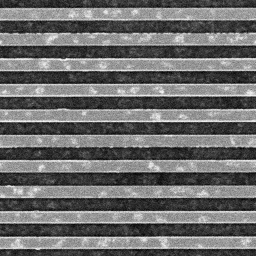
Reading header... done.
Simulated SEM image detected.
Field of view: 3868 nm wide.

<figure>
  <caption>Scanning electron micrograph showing parallel lines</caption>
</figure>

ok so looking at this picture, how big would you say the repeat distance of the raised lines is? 384 nanometers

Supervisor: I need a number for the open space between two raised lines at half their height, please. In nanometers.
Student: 208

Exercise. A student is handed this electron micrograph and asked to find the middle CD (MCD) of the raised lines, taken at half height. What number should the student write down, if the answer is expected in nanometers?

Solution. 178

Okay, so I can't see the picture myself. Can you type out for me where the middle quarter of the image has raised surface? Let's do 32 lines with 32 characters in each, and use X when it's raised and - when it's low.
XXXXXXXXXXXXXXXXXXXXXXXXXXXXXXXX
-----------------------------XXX
--------------------------------
--------------------------------
--------------------------------
XXXXXXXXXXXXXXXXXXXXXXXXXXXXXXXX
XXXXXXXXXXXXXXXXXXXXXXXXXXXXXXXX
XXXXXXXXXXXXXXXXXXXXXXXXXXXXXXXX
--------------------------------
--------------------------------
--------------------------------
XXXXXXX-------------------------
XXXXXXXXXXXXXXXXXXXXXXXXXXXXXXXX
XXXXXXXXXXXXXXXXXXXXXXXXXXXXXXXX
--------------------------------
--------------------------------
--------------------------------
--------------------------------
XXXXXXXXXXXXXXXXXXXXXXXXXXXXXXXX
XXXXXXXXXXXXXXXXXXXXXXXXXXXXXXXX
XXXXXXXXXXXXXXXXXXXXXXXXXXXXXXXX
--------------------------------
--------------------------------
--------------------------------
XXXXXXXXXXXXXXXXXXXXXXXXXXXXXXXX
XXXXXXXXXXXXXXXXXXXXXXXXXXXXXXXX
XXXXXXXXXXXXXXXXXXXXXXXXXXXXXXXX
--------------------------------
--------------------------------
--------------------------------
--------------------------------
XXXXXXXXXXXXXXXXXXXXXXXXXXXXXXXX